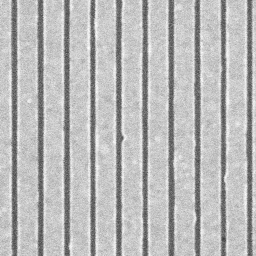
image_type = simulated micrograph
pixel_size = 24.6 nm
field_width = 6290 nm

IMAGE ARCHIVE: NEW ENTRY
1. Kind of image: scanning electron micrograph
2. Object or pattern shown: parallel lines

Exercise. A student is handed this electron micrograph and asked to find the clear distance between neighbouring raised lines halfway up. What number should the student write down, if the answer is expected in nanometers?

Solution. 169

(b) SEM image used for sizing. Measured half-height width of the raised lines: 458 nanometres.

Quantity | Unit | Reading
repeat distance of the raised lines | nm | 642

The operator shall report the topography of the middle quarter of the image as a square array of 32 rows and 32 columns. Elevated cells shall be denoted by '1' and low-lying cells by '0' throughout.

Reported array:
00111100111110011110011111001111
00111100111110011110011111001111
00111100111110011110011111001111
00111100111110011110011111001111
00111100111110011110011111001111
00111100111110011110011111001111
00111100111110011110011111001111
00111100111110011110011111001111
00111100111110011110011111001111
00111100111110011110011111001111
00111100111110011110011111001111
00111100111110011110011111001111
00111100111110011110011111001111
00111100111110011110011111001111
00111100111110011110011111001111
00111100111110011110011111001111
00111100111110011110011111001111
00111100111110011110011111001111
00111100111110011110011111001111
00111100111110011110011111001111
00111100111110011110011111001111
00111100111110011110011111001111
00111100111110011110011111001111
00111100111110011110011111001111
00111100111110011110011111001111
00111100111110011110011111001111
00111100111110011110011111001111
00111100111110011110011111001111
00111100111110011110011111001111
00111100111110011110011111001111
00111100111110011110011111001111
00111100111110011110011111001111